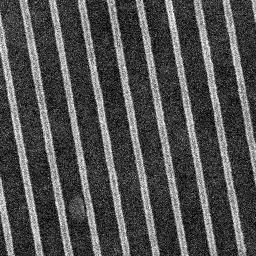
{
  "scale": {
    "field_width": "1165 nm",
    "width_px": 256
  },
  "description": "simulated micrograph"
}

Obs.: parallel lines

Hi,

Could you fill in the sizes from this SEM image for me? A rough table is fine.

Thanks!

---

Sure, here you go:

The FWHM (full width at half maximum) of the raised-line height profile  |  25.7 nanometres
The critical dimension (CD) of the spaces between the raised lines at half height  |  22.5 pixels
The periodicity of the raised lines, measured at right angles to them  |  130 nanometers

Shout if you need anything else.